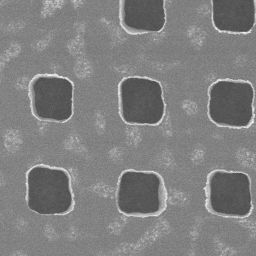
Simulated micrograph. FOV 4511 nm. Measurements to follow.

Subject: holes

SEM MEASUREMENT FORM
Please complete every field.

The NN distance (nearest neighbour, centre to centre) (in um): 1.58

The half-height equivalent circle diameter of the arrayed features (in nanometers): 822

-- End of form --